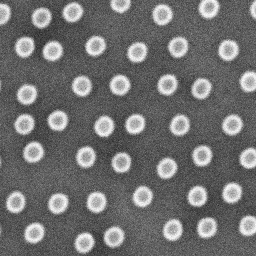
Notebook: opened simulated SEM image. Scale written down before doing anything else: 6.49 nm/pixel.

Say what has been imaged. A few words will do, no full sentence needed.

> a regular array of raised bodies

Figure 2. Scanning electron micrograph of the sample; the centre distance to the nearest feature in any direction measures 229 nm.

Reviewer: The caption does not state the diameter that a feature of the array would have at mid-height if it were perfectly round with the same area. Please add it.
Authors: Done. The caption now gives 118 nanometers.